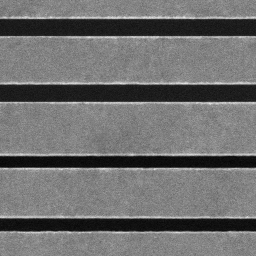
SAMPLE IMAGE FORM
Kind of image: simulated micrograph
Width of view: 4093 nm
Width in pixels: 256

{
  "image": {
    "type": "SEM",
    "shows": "lines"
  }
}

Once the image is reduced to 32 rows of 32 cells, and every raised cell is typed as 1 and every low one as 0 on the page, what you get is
11111111111111111111111111111111
11111111111111111111111111111111
00000000000000000000000000000000
00000000000000000000000000000000
00000000000000000000000000000000
11111111111111111111111111111111
11111111111111111111111111111111
11111111111111111111111111111111
11111111111111111111111111111111
11111111111111111111111111111111
11111111111111111111111111111111
00000000000000000000000000000000
00000000000000000000000000000000
11111111111111111111111111111111
11111111111111111111111111111111
11111111111111111111111111111111
11111111111111111111111111111111
11111111111111111111111111111111
11111111111111111111111111111111
00000000000000000000000000000000
00000000000000000000000000000000
11111111111111111111111111111111
11111111111111111111111111111111
11111111111111111111111111111111
11111111111111111111111111111111
11111111111111111111111111111111
11111111111111111111111111111111
00000000000000000000000000000000
00000000000000000000000000000000
11111111111111111111111111111111
11111111111111111111111111111111
11111111111111111111111111111111